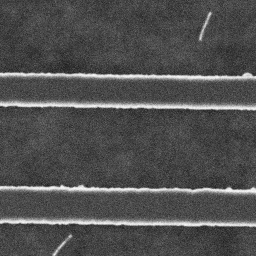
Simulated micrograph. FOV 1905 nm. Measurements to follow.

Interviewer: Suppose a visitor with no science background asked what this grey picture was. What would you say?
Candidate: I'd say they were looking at lines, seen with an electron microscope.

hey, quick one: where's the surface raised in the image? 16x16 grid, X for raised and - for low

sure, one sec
----------------
----------------
----------------
----------------
----------------
XXXXXXXXXXXXXXXX
XXXXXXXXXXXXXXXX
----------------
----------------
----------------
----------------
----------------
XXXXXXXXXXXXXXXX
XXXXXXXXXXXXXXXX
----------------
----------------